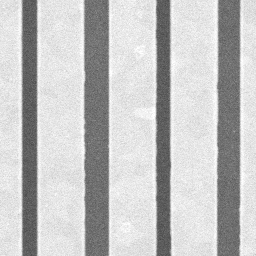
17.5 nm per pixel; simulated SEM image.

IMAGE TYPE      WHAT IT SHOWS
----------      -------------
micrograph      lines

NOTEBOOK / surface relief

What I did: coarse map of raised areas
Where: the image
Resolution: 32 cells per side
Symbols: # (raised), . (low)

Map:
###..#####....#####..######...##
###..#####....#####..######...##
###..#####....#####..######...##
###..#####....#####..######...##
###..#####....#####..######...##
###..#####....#####..######...##
###..#####....#####..######...##
###..#####....#####..######...##
###..#####....#####..######...##
###..######...#####..######...##
###..#####....#####..######...##
###..#####....#####..######...##
###..#####....#####..######...##
###..#####....#####..######...##
###..#####....#####..######...##
###..#####....#####..######...##
###..#####....#####..######...##
###..#####....#####..######...##
###..#####....#####..######...##
###..#####....#####..######...##
###..#####....#####..######...##
###..######...#####..######...##
###..######...#####..######...##
###..######...#####..######...##
###..#####....#####..######...##
###..######...#####..######...##
###..######...#####..######...##
###..######...#####..######...##
###..######...#####..######...##
###..######...#####..######...##
###..#####....#####..######...##
###..######...#####..######...##